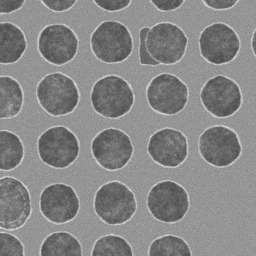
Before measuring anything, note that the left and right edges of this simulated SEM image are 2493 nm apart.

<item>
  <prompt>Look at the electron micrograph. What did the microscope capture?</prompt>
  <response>a regular array of holes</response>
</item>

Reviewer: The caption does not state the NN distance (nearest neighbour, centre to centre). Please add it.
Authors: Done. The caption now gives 500 nanometers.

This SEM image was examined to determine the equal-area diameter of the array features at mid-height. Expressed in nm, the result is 397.